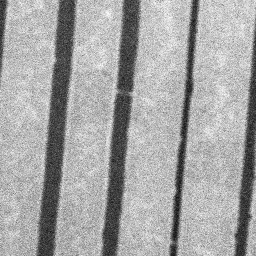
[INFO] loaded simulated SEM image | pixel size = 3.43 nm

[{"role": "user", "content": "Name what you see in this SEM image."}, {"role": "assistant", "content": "one or a few lines or trenches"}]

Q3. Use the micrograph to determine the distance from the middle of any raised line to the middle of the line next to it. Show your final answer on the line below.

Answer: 0.22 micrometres